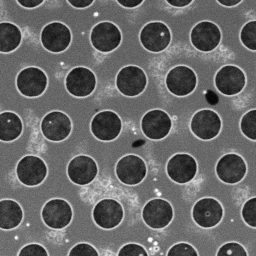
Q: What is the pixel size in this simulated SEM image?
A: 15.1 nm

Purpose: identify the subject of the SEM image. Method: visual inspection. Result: a regular array of holes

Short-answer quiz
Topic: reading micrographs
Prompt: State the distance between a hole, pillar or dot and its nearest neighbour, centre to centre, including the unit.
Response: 749 nm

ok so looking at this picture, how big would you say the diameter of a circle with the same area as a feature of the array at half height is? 453 nm